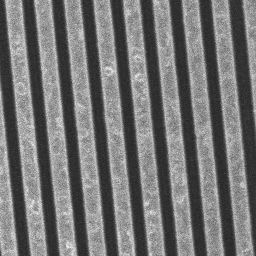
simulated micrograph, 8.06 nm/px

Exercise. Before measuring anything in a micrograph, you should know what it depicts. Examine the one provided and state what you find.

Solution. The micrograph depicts parallel lines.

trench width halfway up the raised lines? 11.3 pixels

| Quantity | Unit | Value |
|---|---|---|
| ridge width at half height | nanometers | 147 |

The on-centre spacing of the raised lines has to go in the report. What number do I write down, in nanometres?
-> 236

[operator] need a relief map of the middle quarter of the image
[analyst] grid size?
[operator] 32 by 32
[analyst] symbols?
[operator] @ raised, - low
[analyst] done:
--@@@@---@@@@---@@@@@---@@@@---@
-@@@@@---@@@@---@@@@@---@@@@---@
--@@@@---@@@@---@@@@@---@@@@---@
--@@@@---@@@@----@@@@---@@@@---@
--@@@@---@@@@@---@@@@---@@@@---@
--@@@@---@@@@@---@@@@---@@@@@---
--@@@@@--@@@@@---@@@@---@@@@@---
--@@@@@--@@@@@---@@@@---@@@@@---
--@@@@@---@@@@---@@@@@--@@@@@---
--@@@@@---@@@@---@@@@@---@@@@---
---@@@@---@@@@---@@@@@---@@@@---
--@@@@@---@@@@@--@@@@@---@@@@---
---@@@@---@@@@@--@@@@@---@@@@---
---@@@@---@@@@@---@@@@---@@@@---
---@@@@---@@@@@---@@@@---@@@@---
---@@@@@--@@@@@---@@@@---@@@@@--
---@@@@@---@@@@---@@@@---@@@@@--
---@@@@@---@@@@---@@@@---@@@@@--
---@@@@@---@@@@---@@@@---@@@@@--
---@@@@@---@@@@---@@@@@---@@@@--
@---@@@@---@@@@---@@@@@---@@@@--
@---@@@@---@@@@---@@@@@---@@@@--
@---@@@@---@@@@@--@@@@@---@@@@--
@---@@@@---@@@@----@@@@---@@@@--
@---@@@@---@@@@@---@@@@---@@@@--
@---@@@@@--@@@@@---@@@@---@@@@@-
@---@@@@@--@@@@@---@@@@---@@@@@-
@---@@@@@--@@@@@---@@@@---@@@@@-
@---@@@@@---@@@@---@@@@---@@@@@-
@---@@@@@---@@@@---@@@@@---@@@@-
@@--@@@@@---@@@@---@@@@@---@@@@-
@@---@@@@---@@@@---@@@@@---@@@@-